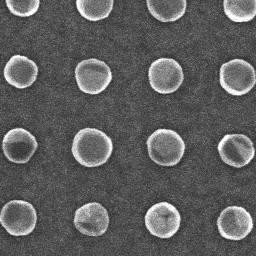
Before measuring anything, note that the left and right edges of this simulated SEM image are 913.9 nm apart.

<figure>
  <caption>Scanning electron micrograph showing a regular array of raised bodies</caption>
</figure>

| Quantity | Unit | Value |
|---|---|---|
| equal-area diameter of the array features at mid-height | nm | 121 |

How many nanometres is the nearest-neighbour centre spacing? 257